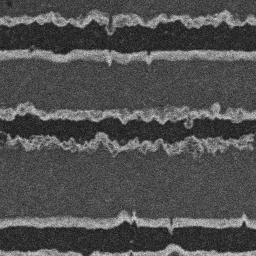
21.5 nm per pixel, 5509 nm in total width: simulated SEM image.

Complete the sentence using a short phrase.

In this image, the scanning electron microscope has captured one or a few lines or trenches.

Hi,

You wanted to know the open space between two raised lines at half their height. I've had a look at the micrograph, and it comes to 1450 nanometres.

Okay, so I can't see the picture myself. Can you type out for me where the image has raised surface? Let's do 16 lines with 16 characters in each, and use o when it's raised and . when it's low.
................
oooooooooooooooo
oooooooooooooooo
...o...o.o......
................
................
................
oooooooooooooooo
oooooooooooooooo
................
................
................
................
................
oooooooooooooooo
oooooooooooooooo